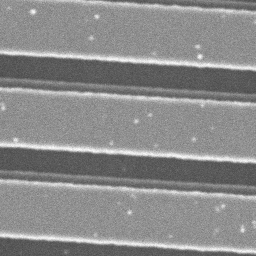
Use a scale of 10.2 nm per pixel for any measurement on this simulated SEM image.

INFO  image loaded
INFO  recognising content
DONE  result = lines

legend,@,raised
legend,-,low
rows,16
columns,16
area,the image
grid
@@@@@@@@@@@@----
@@@@@@@@@@@@@@@@
@@@@@@@@@@@@@@@@
---@@@@@@@@@@@@@
----------------
----------------
@@@@@@@@@@@@@@@@
@@@@@@@@@@@@@@@@
@@@@@@@@@@@@@@@@
------@@@@@@@@@@
----------------
@@@@------------
@@@@@@@@@@@@@@@@
@@@@@@@@@@@@@@@@
@@@@@@@@@@@@@@@@
-----------@@@@@